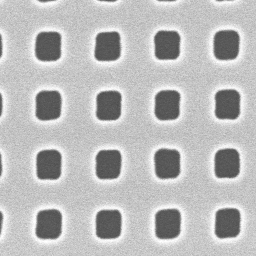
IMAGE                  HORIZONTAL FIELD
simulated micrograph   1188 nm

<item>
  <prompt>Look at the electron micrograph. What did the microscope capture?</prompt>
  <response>a regular array of holes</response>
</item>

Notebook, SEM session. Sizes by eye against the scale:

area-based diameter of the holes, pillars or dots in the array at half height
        139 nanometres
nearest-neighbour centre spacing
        274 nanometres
